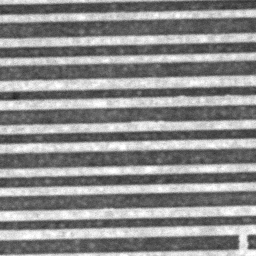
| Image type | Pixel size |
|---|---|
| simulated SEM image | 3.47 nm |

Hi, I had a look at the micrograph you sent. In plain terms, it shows parallel lines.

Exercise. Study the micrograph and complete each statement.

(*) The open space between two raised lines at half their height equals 53.4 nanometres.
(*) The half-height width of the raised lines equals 0.0269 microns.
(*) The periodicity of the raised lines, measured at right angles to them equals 0.0752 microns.